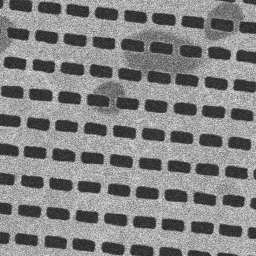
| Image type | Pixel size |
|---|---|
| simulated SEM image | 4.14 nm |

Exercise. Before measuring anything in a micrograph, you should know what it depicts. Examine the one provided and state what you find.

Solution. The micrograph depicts a regular array of holes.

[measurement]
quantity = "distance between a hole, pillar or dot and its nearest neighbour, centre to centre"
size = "118 nm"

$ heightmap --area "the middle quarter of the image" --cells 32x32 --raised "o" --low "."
.....oo....ooooooooooooooooooooo
.....o......oo.....ooooooooooooo
.....oo.....o......oo.....oo..oo
oooooooooo.ooo.....oo......o....
oooooooooooooooooooooo.....o....
ooooooooooooooooooooooooooooooo.
oooooooooooooooooooooooooooooooo
....oo..oooooooooooooooooooooooo
....oo.....oo...o.oooooooooooooo
....oo.....oo......o......oooooo
oooooo.....oo......o......o.....
ooooooooooooooooo.oo......oo....
ooooooooooooooooooooooooooooo...
oooooooooooooooooooooooooooooooo
...ooooooooooooooooooooooooooooo
....o.....ooo.oooooooooooooooooo
...oo......o......oo....oooooooo
oooooo.....o......o......oo.....
ooooooooooooooo...oo.....o......
ooooooooooooooooooooooooooo.....
oooooooooooooooooooooooooooooooo
oooooooooooooooooooooooooooooooo
...o.....ooooooooooooooooooooooo
...o......o......oo..ooooooooooo
o.ooo.....o......oo.....oo....oo
ooooooooooooo....oo.....oo......
ooooooooooooooooooooo...oo......
oooooooooooooooooooooooooooooooo
oooooooooooooooooooooooooooooooo
..oo....oooooooooooooooooooooooo
..o......oo.....oooooooooooooooo
..o......oo......o......oo...ooo